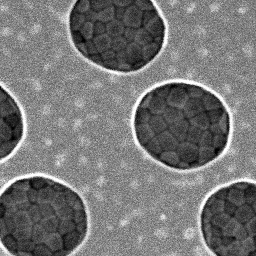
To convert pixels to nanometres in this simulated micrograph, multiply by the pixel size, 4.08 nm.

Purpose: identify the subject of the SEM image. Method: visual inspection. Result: holes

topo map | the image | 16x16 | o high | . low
ooooo.....oooooo
oooo......oooooo
ooooo.....oooooo
ooooo.....oooooo
oooooooooooooooo
oooooooooo...ooo
.oooooooo.....oo
.ooooooo......oo
.oooooooo.....oo
.oooooooo.....oo
ooooooooooo.oooo
o...oooooooooo..
.....oooooooo...
.....oooooooo...
.....oooooooo...
.....oooooooo...